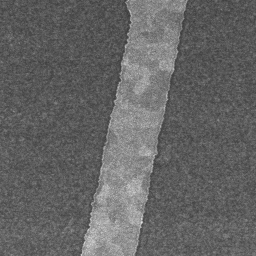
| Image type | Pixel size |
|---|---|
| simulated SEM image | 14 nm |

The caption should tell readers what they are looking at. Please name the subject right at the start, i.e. one or a few lines or trenches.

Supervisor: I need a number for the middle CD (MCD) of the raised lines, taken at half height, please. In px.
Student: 50.3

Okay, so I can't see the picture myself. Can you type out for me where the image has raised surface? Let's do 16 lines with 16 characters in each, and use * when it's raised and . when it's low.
........****....
........***.....
........***.....
........***.....
........***.....
.......****.....
.......***......
.......***......
.......***......
......****......
......***.......
......***.......
......***.......
......***.......
.....****.......
.....****.......